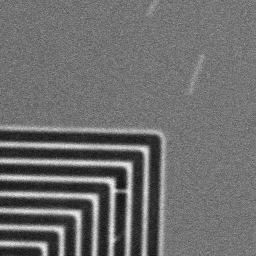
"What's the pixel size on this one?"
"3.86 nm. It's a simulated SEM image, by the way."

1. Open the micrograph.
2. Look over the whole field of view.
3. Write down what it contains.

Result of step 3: groups of lines, slits or small figures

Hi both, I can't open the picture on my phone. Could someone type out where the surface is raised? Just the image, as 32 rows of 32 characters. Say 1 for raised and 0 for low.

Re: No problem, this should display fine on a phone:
11111111111111111111111111111111
11111111111111111111111111111111
11111111111111111111111111111111
11111111111111111111111111111111
11111111111111111111111111111111
11111111111111111111111111111111
11111111111111111111111111111111
11111111111111111111111111111111
11111111111111111111111111111111
11111111111111111111111111111111
11111111111111111111111111111111
11111111111111111111111111111111
11111111111111111111111111111111
11111111111111111111111111111111
11111111111111111111111111111111
11111111111111111111111111111111
00000000000001111111111111111111
00000000000000000000111111111111
00000000111000000100111111111111
00000000000000000010111111111111
00000000000000000000111111111111
00000000000000000000111111111111
00000011000101000000111111111111
00000000000000100000111111111111
00110001000100000000111111111111
00000000000000000000111111111111
00011000010000000000111111111111
00000000000000000000111111111111
00000001000000000000111111111111
00000001000000000000111111111111
10000100000000000000111111111111
00000100000000000000111111111111